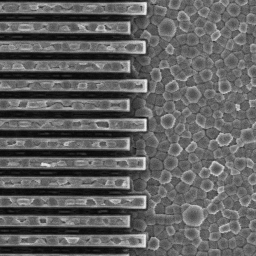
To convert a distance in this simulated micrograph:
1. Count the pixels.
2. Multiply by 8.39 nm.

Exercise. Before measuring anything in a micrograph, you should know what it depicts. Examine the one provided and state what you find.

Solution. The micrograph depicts parallel lines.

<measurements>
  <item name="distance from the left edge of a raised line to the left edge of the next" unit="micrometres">0.163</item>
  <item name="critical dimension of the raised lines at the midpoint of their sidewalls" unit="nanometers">92.3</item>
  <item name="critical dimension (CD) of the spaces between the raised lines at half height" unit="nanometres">70.3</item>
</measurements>